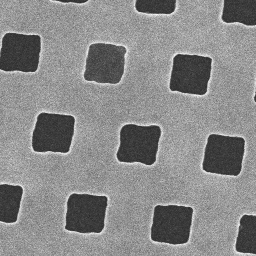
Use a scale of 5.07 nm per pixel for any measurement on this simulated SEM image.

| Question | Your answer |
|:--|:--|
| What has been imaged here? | holes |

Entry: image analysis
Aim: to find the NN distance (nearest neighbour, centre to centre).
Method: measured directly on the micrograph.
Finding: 437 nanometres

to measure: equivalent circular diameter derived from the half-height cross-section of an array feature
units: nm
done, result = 218